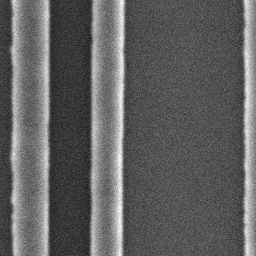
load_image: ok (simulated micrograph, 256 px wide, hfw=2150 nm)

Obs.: lines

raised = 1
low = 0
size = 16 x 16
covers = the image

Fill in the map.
0110001100000001
0110001100000001
0110001100000001
0110001100000001
0110001100000001
0110001100000001
0110001100000001
0110001100000001
0110001100000001
0110001100000001
0110001100000001
0110001100000001
0110001100000001
0110001100000001
0110001100000001
0110001100000001